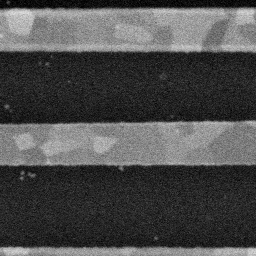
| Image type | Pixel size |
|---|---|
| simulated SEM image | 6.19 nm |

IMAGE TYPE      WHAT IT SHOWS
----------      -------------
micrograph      lines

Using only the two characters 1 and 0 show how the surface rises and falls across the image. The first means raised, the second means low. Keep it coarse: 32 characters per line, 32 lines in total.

00000000000000000000000000000000
11111111111111111111111111111111
11111111111111111111111111111111
11111111111111111111111111111111
11111111111111111111111111111111
11111111111111111111111111111111
00000000000000000000000000000000
00000000000000000000000000000000
00000000000000000000000000000000
00000000000000000000000000000000
00000000000000000000000000000000
00000000000000000000000000000000
00000000000000000000000000000000
00000000000000000000000000000000
00000000000000000000000000000000
00000000011111111111111111111111
11111111111111111111111111111111
11111111111111111111111111111111
11111111111111111111111111111111
11111111111111111111111111111111
11111111111111111111111111111111
00000000000000000000000000000000
00000000000000000000000000000000
00000000000000000000000000000000
00000000000000000000000000000000
00000000000000000000000000000000
00000000000000000000000000000000
00000000000000000000000000000000
00000000000000000000000000000000
00000000000000000000000000000000
00000000000000000000000000000000
11111111111111111111111111111111